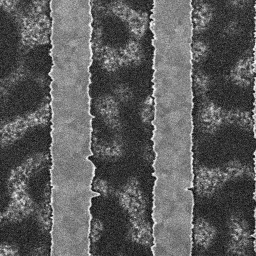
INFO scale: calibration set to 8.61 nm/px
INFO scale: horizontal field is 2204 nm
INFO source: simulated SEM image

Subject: one or a few lines or trenches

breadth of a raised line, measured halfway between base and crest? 330 nanometres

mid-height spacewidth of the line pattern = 538 nm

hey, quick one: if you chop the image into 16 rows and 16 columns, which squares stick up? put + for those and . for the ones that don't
...+++....++....
...+++...+++....
...+++....++....
...+++....++....
...+++....++....
...+++....++....
...+++....++....
...+++....++....
...+++....++....
...+++....++....
...+++....++....
...+++....++....
...+++....++....
...+++....++....
...+++....++....
...+++....++....